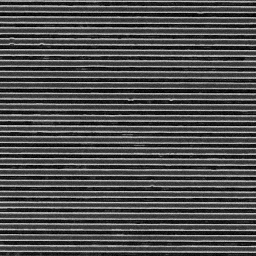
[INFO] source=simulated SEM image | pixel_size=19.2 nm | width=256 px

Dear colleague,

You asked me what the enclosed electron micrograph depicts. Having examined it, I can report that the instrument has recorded parallel lines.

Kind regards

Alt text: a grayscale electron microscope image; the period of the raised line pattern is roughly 209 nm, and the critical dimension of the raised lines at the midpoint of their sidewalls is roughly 117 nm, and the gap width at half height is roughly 101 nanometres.